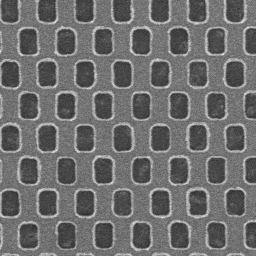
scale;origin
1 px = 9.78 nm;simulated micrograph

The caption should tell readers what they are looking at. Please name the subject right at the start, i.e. a regular array of holes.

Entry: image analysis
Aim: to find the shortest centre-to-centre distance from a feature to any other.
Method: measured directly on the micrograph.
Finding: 363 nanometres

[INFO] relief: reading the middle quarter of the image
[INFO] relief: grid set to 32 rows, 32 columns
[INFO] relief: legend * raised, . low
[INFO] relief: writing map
***.....****.....*****....*****.
***.....****.....*****....*****.
***.....****.....*****.....****.
***.....****.....*****.....****.
***.....****.....*****....*****.
***....******...******....******
********************************
..******....******...******...**
...****.....*****.....****.....*
...****.....*****.....****.....*
...****.....*****.....****.....*
...****.....*****.....****.....*
...*****....*****.....****.....*
..******....******...******...**
********************************
***....******...*******...******
***....*****.....*****....*****.
***.....****.....*****....*****.
***.....****.....*****....*****.
***.....****.....*****.....****.
***.....****.....*****....*****.
***....******....*****....******
********************************
..******...*******...******...**
...*****....*****.....****.....*
...****.....*****.....****.....*
...****.....*****.....****.....*
...****.....*****.....****.....*
...****.....*****.....****.....*
...*****....******...******....*
********************************
****..********..*******..*******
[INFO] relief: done